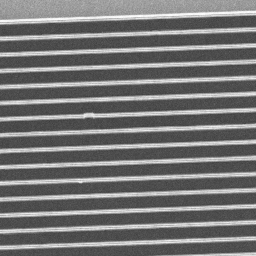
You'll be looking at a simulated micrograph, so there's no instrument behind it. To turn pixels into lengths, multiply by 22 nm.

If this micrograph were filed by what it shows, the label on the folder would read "parallel lines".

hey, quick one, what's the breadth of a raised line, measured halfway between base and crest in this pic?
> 77 nanometres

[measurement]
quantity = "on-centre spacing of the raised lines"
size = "0.354 micrometres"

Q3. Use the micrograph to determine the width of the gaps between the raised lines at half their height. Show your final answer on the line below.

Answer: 0.283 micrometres